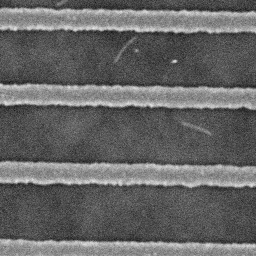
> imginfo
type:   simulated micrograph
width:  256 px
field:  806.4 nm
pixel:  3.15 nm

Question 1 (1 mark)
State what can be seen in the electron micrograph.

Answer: lines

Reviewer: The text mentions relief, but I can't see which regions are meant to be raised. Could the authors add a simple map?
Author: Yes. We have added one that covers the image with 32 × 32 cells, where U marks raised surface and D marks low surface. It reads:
DDDDDDDDDDDDDDDDDDDDDDDDDDDDDDDD
UUUUUUUUUUUUUUUUUUUDUDDDDDDDDDDD
UUUUUUUUUUUUUUUUUUUUUUUUUUUUUUUU
DUUUDUUDDUUUUUUUUUUUUUUUUUUUUUUU
DDDDDDDDDDDDDDDDDDDDDDDDDDDDDDDD
DDDDDDDDDDDDDDDDDDDDDDDDDDDDDDDD
DDDDDDDDDDDDDDDDDDDDDDDDDDDDDDDD
DDDDDDDDDDDDDDDDDDDDDDDDDDDDDDDD
DDDDDDDDDDDDDDDDDDDDDDDDDDDDDDDD
DDDDDDDDDDDDDDDDDDDDDDDDDDDDDDDD
DDDDDDDDDDDDDDDDDDDDDDDDDDDDDDDD
UUUUUUUUUUUUUUUUUUUUUUUUUUUUUUUU
UUUUUUUUUUUUUUUUUUUUUUUUUUUUUUUU
DDDDDDDDDDDDDDDDDDDDDDDDDDDDDDDD
DDDDDDDDDDDDDDDDDDDDDDDDDDDDDDDD
DDDDDDDDDDDDDDDDDDDDDDDDDDDDDDDD
DDDDDDDDDDDDDDDDDDDDDDDDDDDDDDDD
DDDDDDDDDDDDDDDDDDDDDDDDDDDDDDDD
DDDDDDDDDDDDDDDDDDDDDDDDDDDDDDDD
DDDDDDDDDDDDDDDDDDDDDDDDDDDDDDDD
UUDDDDDDDDDDDDDDDDDDDDDDDDDDDDDD
UUUUUUUUUUUUUUUUUUUUUUUUUUUUUUUU
UUUUUUUUUUUUUUUUUUUUUUUUUUUUUUUU
DDDDDDDDDDDDDDDDDDDDDDDDDDDDDDDD
DDDDDDDDDDDDDDDDDDDDDDDDDDDDDDDD
DDDDDDDDDDDDDDDDDDDDDDDDDDDDDDDD
DDDDDDDDDDDDDDDDDDDDDDDDDDDDDDDD
DDDDDDDDDDDDDDDDDDDDDDDDDDDDDDDD
DDDDDDDDDDDDDDDDDDDDDDDDDDDDDDDD
DDDDDDDDDDDDDDDDDDDDDDDDDDDDDDDD
UUUUUUUUUUUUUUUUUUUUUDDDDDDDDDDD
UUUUUUUUUUUUUUUUUUUUUUUUUUUUUUUU